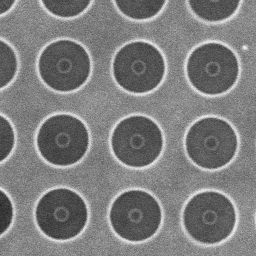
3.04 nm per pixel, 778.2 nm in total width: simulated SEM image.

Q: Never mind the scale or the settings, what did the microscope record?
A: an array of small figures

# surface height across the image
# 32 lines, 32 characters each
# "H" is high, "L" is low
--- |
LLHHHLLLLLLHHHLLLLLLLHHHLLLLLLHH
LHHHHHLLLLHHHHHLLLLLHHHHLLLLLHHH
HHHHHHHHHHHHHHHHHLHHHHHHHLLLHHHH
HHHHHHHHHHHHHHHHHHHHHHHHHHHHHHHH
HHHHHHHHHHHHHHHHHHHHHHHHHHHHHHHH
LHHHHHLLLLHHHHHHLLLHHHHHHLLLHHHH
LLHHHLLLLLLHHHHLLLLLHHHHLLLLLHHH
LLHHHLLLLLLHHHLLLLLLHHHLLLLLLLHH
LLHHHLLLLLLHHHLLLHLLLHHLLLLLLLHH
LLHHHLLLLLLHHHLLLLLLHHHLLLLLLLHH
LHHHHHLLLLHHHHHLLLLLHHHHLLLLLHHH
HHHHHHHHHHHHHHHHLLLHHHHHHLLLHHHH
HHHHHHHHHHHHHHHHHHHHHHHHHHHHHHHH
HHHHHHHHHHHHHHHHHHHHHHHHHHHHHHHH
HHHHHHHLLHHHHHHHHLHHHHHHHHHHHHHH
LHHHHLLLLLHHHHHLLLLLHHHHLLLLLHHH
LLHHHLLLLLLHHHLLLLLLHHHLLLLLLHHH
LLHHHLLLLLLHHHLLLLLLHHHLLLLLLLHH
LLHHHLLLLLLHHHLLLLLLHHHLLLLLLLHH
LHHHHLLLLLHHHHLLLLLLHHHHLLLLLHHH
HHHHHHLLLHHHHHHHLLLHHHHHHLLLHHHH
HHHHHHHHHHHHHHHHHHHHHHHHHHHHHHHH
HHHHHHHHHHHHHHHHHHHHHHHHHHHHHHHH
HHHHHHHLHHHHHHHHHHHHHHHHHHHHHHHH
LHHHHLLLLLHHHHHLLLLHHHHHLLLLHHHH
LHHHHLLLLLLHHHLLLLLLHHHLLLLLLHHH
LLHHLLLLLLLHHHLLLLLLHHHLLLLLLHHH
LLHHHLLLLLLHHHLLLLLLHHHLLLLLLLHH
LHHHHLLLLLHHHHLLLLLLHHHLLLLLLHHH
HHHHHHLLLHHHHHHLLLLHHHHHLLLLLHHH
HHHHHHHHHHHHHHHHHHHHHHHHHLLHHHHH
HHHHHHHHHHHHHHHHHHHHHHHHHHHHHHHH